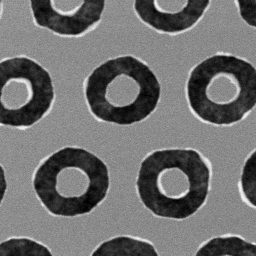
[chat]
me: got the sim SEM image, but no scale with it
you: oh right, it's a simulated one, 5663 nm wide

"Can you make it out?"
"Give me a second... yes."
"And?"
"ring-shaped grooves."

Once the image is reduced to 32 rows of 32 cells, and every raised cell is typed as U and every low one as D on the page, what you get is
UUUUDDUUUUDDDUUUUDDUUUUDDDUUUUDD
UUUUDDDUUDDDDUUUUDDDUUDDDUUUUUDD
UUUUDDDDDDDDUUUUUUDDDDDDDUUUUUUD
UUUUUUDDDDDUUUUUUUUDDDDDUUUUUUUU
UUUUUUUUUUUUUUUUUUUUUUUUUUUUUUUU
UUUUUUUUUUUUUUUUUUUUUUUUUUUUUUUU
UUUUUUUUUUUUUUUUUUUUUUUUUUUUUUUU
UDDDUUUUUUUUUUDDDUUUUUUUUUDDDDDU
DDDDDUUUUUUUDDDDDDDUUUUUDDDDDDDD
DDDDDDUUUUUDDDDUDDDUUUUUDDDUDDDD
DUUUDDDUUUUDDDUUUDDDUUUDDDUUUUDD
UUUUDDDUUUUDDUUUUDDDUUUUDDUUUUDD
UUUUDDDUUUUDDUUUUDDDUUUUDDUUUDDD
DUDDDDUUUUUDDDDDDDDUUUUUDDDDDDDD
DDDDDUUUUUUUDDDDDDUUUUUUUDDDDDUU
DDDDUUUUUUUUUUUDUUUUUUUUUUUDDUUU
UUUUUUUUUUUUUUUUUUUUUUUUUUUUUUUU
UUUUUUUUUUUUUUUUUUUUUUUUUUUUUUUU
UUUUUUUUDDUUUUUUUUUUUUUUUUUUUUUU
UUUUUUDDDDDDUUUUUUUDDDDDDUUUUUUD
UUUUUDDDDDDDDUUUUUDDDDDDDDUUUUUD
DUUUDDDDUUDDDDUUUDDDUUUDDDUUUUDD
DUUUDDDUUUUDDDUUUDDDUUUDDDUUUUDD
DUUUDDDUUUUDDUUUUDDDUUUUDDUUUUDD
UUUUUDDDUUDDDUUUUDDDDUUDDDUUUUUD
UUUUUDDDDDDDUUUUUUDDDDDDDUUUUUUD
UUUUUUDDDDDUUUUUUUUDDDDDUUUUUUUU
UUUUUUUUUUUUUUUUUUUUUUUUUUUUUUUU
UUUUUUUUUUUUUUUUUUUUUUUUUUUUUUUU
UUUUUUUUUUUUUUUUUUUUUUUUUUUUUUUU
DDDDDUUUUUUUUDDDDDDUUUUUUUDDDDDD
DDDDDDUUUUUUDDDDDDDDUUUUUDDDDDDD